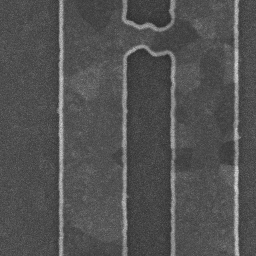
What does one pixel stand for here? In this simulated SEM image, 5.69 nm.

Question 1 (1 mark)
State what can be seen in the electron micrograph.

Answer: one or a few lines or trenches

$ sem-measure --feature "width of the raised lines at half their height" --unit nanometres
363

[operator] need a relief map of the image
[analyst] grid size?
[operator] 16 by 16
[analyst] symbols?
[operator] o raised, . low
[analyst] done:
....oooo...oooo.
....oooo...oooo.
....ooooooooooo.
....oooo...oooo.
....oooo...oooo.
....oooo...oooo.
....oooo...oooo.
....oooo...oooo.
....oooo...oooo.
....oooo...oooo.
....oooo...oooo.
....oooo...oooo.
....oooo...oooo.
....oooo...oooo.
....oooo...oooo.
....oooo...oooo.